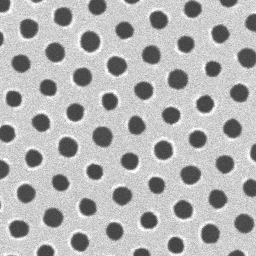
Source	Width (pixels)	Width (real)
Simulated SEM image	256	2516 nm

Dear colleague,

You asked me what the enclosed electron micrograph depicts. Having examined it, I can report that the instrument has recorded a regular array of holes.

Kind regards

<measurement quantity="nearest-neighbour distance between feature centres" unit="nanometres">351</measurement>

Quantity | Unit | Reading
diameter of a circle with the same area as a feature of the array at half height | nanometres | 184